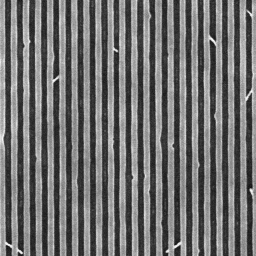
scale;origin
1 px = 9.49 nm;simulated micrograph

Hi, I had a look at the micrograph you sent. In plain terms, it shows parallel lines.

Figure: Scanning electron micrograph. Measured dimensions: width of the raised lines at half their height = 52.2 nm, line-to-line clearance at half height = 0.0617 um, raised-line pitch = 0.114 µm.